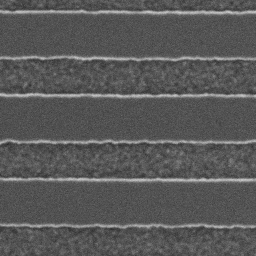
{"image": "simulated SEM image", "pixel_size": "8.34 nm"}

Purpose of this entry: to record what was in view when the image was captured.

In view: lines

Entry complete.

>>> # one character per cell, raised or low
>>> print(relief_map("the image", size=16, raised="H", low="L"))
LLLLLLLLLLLLLLLL
HHHHHHHHHHHHHHHH
HHHHHHHHHHHHHHHH
HHHHHHHHHHHHHHHH
LLLLLLLLLLLLLLLL
LLLLLLLLLLLLLLLL
HHHHHHHHHHHHHHHH
HHHHHHHHHHHHHHHH
HHHHHHHHHHHHHHHH
LLLLLLLLLLLLLLLL
LLLLLLLLLLLLLLLL
HHHHHHHHHHHHHHHH
HHHHHHHHHHHHHHHH
HHHHHHHHHHHHHHHH
LLLLLLLLLLLLLLLL
LLLLLLLLLLLLLLLL